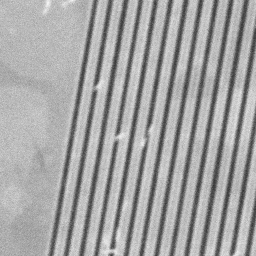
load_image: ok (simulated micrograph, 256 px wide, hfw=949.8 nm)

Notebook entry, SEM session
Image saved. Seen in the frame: parallel lines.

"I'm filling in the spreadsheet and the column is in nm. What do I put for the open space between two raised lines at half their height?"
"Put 25.1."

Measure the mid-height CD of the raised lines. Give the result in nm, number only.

32.4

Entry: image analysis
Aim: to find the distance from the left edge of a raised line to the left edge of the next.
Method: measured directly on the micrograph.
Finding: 14.8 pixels